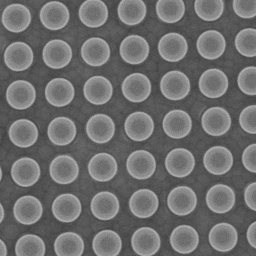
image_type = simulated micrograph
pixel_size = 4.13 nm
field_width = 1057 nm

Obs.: an array of small figures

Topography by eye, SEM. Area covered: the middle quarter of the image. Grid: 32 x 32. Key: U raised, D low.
DDDDDDDDDDDDDDDDDDDDDDDDDDDDDDDD
DDDDDDDDDDDDDDDDDDDDDDDDDDDDDDDD
DDDDDDDDDDDDDDDDDUUUDDDDDUUUUUDD
DDDDDDDUUUDDDDDUUUUUUDDDDUUUUUUD
UDDDDDUUUUUDDDDUUUUUUDDDUUUUUUUD
UUDDDUUUUUUUDDDUUUUUUUDDUUUUUUUD
UUDDDUUUUUUUDDDUUUUUUUDDUUUUUUUD
UUDDDUUUUUUUDDDUUUUUUDDDDUUUUUUD
UUDDDUUUUUUUDDDDUUUUUDDDDDUUUUDD
UUDDDDDUUUUDDDDDDDDDDDDDDDDDDDDD
DDDDDDDDDDDDDDDDDDDDDDDDDDDDDDDD
DDDDDDDDDDDDDDDDDDDDDDDDDDDDDDDD
DDDDDDDDDDDDDDDDDUUUUDDDDDUUUUUD
UDDDDDDUUUUDDDDDUUUUUUDDDUUUUUUD
UUDDDDUUUUUUDDDUUUUUUUDDDUUUUUUU
UUUDDDUUUUUUDDDUUUUUUUDDDUUUUUUU
UUUDDDUUUUUUUDDUUUUUUUDDDUUUUUUU
UUUDDDUUUUUUDDDDUUUUUUDDDDUUUUUD
UUDDDDDUUUUUDDDDDUUUUDDDDDDUDDDD
UUDDDDDDUUDDDDDDDDDDDDDDDDDDDDDD
DDDDDDDDDDDDDDDDDDDDDDDDDDDDDDDD
DDDDDDDDDDDDDDDDDDDDDDDDDDDUUUUD
DDDDDDDDUUUDDDDDDUUUUUDDDDUUUUUU
UUDDDDDUUUUUDDDDUUUUUUDDDUUUUUUU
UUUDDDUUUUUUUDDDUUUUUUUDDUUUUUUU
UUUDDDUUUUUUUDDDUUUUUUUDDUUUUUUU
UUUDDDUUUUUUUDDDUUUUUUUDDDUUUUUU
UUUDDDUUUUUUUDDDDUUUUUDDDDDUUUUD
UUUDDDDUUUUUDDDDDDUUUDDDDDDDDDDD
UUDDDDDDDDDDDDDDDDDDDDDDDDDDDDDD
DDDDDDDDDDDDDDDDDDDDDDDDDDDDDDDD
DDDDDDDDDDDDDDDDDDDUUDDDDDDUUUUU